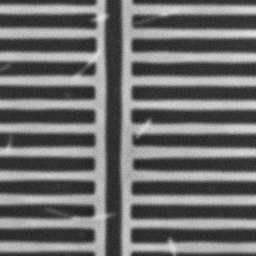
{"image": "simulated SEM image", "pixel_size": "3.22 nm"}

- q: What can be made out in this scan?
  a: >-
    groups of lines, slits or small figures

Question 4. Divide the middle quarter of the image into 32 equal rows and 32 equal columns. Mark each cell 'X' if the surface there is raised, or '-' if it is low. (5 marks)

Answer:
--------XX-----XX---------------
--------XX-----XX---------------
--------XX-----XX---------------
XXXXXXXXXX-----XXXXXXXXXXXXXXXXX
XXXXXXXXXX-----XXXXXXXXXXXXXXXXX
-------XXX----XXX---------------
--------XX----XXX---------------
--------XX----XXX---------------
--------XX----XXX---------------
XXXXXXXXXX-----XXXXXXXXXXXXXXXXX
XXXXXXXXXX-----XXXXXXXXXXXXXXXXX
--------XX-----XX---------------
--------XX-----X----------------
--------XX-----XX---------------
--------XX-----XX---------------
XXXXXXXXXX-----XXXXXXXXXXXXXXXXX
XXXXXXXXXX----XXXXXXXXXXXXXXXXXX
--------XX----XXXXX-------------
--------XX----XXX---------------
--------XX----XXX---------------
--------XX----XXX---------------
XXXXXXXXXX----XXXXXXXXXXXXXXXXXX
XXXXXXXXXX----XXXXXXXXXXXXXXXXXX
--------XX----XXXX--------------
--------XX----XXX---------------
--------XX----XXX---------------
--------XX----XXX---------------
XXXXXXXXXX----XXXXXXXXXXXXXXXXXX
XXXXXXXXXX----XXXXXXXXXXXXXXXXXX
--------XX----XXX---------------
--------XX----XXX---------------
--------XX----XXX---------------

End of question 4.